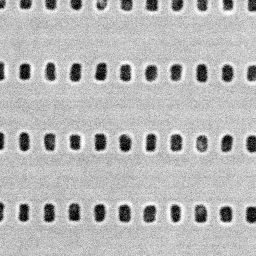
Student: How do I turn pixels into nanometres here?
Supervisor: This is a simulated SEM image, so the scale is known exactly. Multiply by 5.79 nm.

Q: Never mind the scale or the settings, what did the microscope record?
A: a regular array of holes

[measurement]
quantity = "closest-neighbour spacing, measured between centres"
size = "145 nanometres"